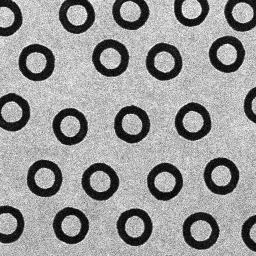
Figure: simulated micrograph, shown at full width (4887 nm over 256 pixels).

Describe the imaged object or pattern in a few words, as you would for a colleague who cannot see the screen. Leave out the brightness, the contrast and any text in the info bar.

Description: a regular array of ring-shaped grooves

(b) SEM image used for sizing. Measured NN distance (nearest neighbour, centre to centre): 55.6 pixels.